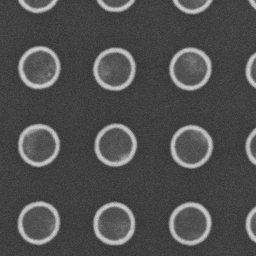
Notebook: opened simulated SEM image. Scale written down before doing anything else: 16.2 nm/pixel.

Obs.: a regular array of raised bodies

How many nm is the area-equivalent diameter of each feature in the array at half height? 628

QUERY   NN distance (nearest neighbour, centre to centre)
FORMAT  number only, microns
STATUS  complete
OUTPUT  1.23